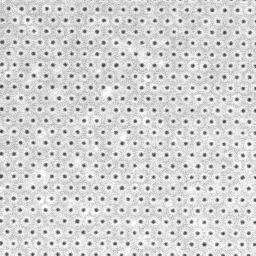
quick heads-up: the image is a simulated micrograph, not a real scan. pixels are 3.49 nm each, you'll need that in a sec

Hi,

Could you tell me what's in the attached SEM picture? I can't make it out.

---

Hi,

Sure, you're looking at a regular array of holes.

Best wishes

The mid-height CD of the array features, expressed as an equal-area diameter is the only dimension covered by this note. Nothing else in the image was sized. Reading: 14.7 nanometres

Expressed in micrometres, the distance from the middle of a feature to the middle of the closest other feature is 0.0427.